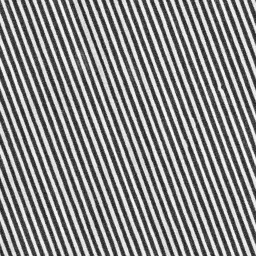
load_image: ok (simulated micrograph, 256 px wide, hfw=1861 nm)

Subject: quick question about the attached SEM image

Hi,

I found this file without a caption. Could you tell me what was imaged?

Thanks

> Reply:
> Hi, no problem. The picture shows parallel lines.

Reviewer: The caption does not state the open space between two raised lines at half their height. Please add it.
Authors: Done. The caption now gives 33.3 nm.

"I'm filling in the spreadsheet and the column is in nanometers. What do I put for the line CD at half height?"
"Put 19.6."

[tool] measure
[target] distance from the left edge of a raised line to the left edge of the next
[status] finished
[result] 55.3 nm